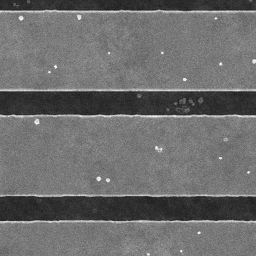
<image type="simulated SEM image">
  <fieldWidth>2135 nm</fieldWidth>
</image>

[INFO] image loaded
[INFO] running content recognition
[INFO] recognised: lines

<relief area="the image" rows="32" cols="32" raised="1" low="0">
00000000000000000000000000000000
11111111111111111111111111111111
11111111111111111111111111111111
11111111111111111111111111111111
11111111111111111111111111111111
11111111111111111111111111111111
11111111111111111111111111111111
11111111111111111111111111111111
11111111111111111111111111111111
11111111111111111111111111111111
11111111111111111111111111111111
00000000000000000000000000000000
00000000000000000000000000000000
00000000000000000000000000000000
11111111111111111111111111111111
11111111111111111111111111111111
11111111111111111111111111111111
11111111111111111111111111111111
11111111111111111111111111111111
11111111111111111111111111111111
11111111111111111111111111111111
11111111111111111111111111111111
11111111111111111111111111111111
11111111111111111111111111111111
10001111000111100011111100110111
00000000000000000000000000000000
00000000000000000000000000000000
00000000000000000000000000000000
11111111111111111111111111111111
11111111111111111111111111111111
11111111111111111111111111111111
11111111111111111111111111111111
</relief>